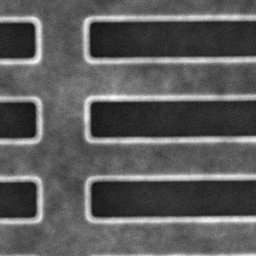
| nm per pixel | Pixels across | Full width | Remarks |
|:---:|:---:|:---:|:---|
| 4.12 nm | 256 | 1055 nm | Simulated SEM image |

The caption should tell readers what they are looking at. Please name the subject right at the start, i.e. groups of lines, slits or small figures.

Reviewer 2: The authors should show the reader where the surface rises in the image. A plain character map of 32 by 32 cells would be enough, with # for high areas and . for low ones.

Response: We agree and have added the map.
################################
################################
############....................
.....######.....................
.....######.....................
.....######.....................
.....######.....................
....########....################
################################
################################
################################
################################
....########....................
.....######.....................
.....######.....................
.....######.....................
.....######.....................
....############################
################################
################################
################################
################################
....########....................
.....######.....................
.....######.....................
.....######.....................
.....######.....................
...#############################
################################
################################
################################
################################